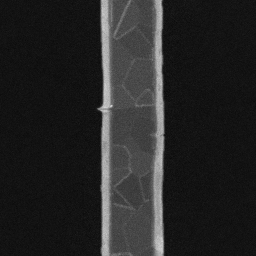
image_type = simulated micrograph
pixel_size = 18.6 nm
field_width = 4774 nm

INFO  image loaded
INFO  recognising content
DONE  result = one or a few lines or trenches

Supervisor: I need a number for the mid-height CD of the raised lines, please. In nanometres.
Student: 1000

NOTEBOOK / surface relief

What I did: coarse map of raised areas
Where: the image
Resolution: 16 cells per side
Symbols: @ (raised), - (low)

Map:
-------@@@------
-------@@@------
-------@@@------
-------@@@------
-------@@@------
-------@@@------
-------@@@------
-------@@@------
-------@@@------
-------@@@------
-------@@@------
-------@@@------
-------@@@------
-------@@@------
-------@@@------
-------@@@------